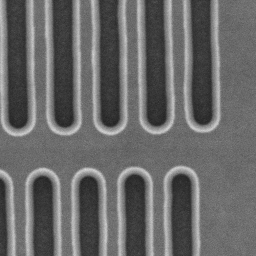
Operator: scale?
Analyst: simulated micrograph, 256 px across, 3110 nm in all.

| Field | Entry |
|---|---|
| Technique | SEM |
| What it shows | groups of lines, slits or small figures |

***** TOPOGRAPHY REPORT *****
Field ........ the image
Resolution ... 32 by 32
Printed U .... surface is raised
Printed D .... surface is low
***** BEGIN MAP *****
DDDDUUDDDUUUDDDUUUDDDUUDDDDUUUUU
DDDDUUDDDUUUDDDUUUDDDUUDDDDUUUUU
DDDDUUDDDDUUDDDUUUDDDUUDDDDUUUUU
DDDDUUDDDDUUDDDUUUDDDUUDDDDUUUUU
DDDDUUDDDDUUDDDUUUDDDUUUDDDUUUUU
DDDDUUDDDUUUDDDUUUDDDUUUDDDUUUUU
DDDDUUDDDDUUDDDUUUDDDUUUDDDUUUUU
DDDDUUDDDDUUDDDUUUDDDUUUDDDUUUUU
DDDDUUDDDDUUDDDUUUDDDUUUDDDUUUUU
DDDDUUDDDDUUDDDUUUDDDUUUDDDUUUUU
DDDDUUDDDDUUDDDUUUDDDUUDDDDUUUUU
DDDDUUDDDDUUDDDUUUDDDUUDDDDUUUUU
UDDDUUDDDDUUDDDUUUDDDUUUDDDUUUUU
UDDDUUDDDDUUDDDUUUDDDUUUDDDUUUUU
UDDDUUDDDDUUDDDUUUDDDUUUDDDUUUUU
UDDDUUUDDUUUDDDUUUDDDUUUDDDUUUUU
UUUUUUUUUUUUUUUUUUUUUUUUUUUUUUUU
UUUUUUUUUUUUUUUUUUUUUUUUUUUUUUUU
UUUUUUUUUUUUUUUUUUUUUUUUUUUUUUUU
UUUUUUUUUUUUUUUUUUUUUUUUUUUUUUUU
UUUUUUUUUUUUUUUUUUUUUUUUUUUUUUUU
UUUUUUUUUUUUUUUUDDUUUUDUUUUUUUUU
DUUUDDDUUUDDDUUDDDUUUDDDUUUUUUUU
DUUUDDDUUDDDDUUDDDDUUDDDUUUUUUUU
DUUUDDDUUDDDDUUDDDDUUDDDUUUUUUUU
DUUUDDDUUDDDDUUDDDDUUDDDUUUUUUUU
DUUUDDDUUDDDDUUDDDDUUDDDUUUUUUUU
DUUUDDDUUDDDDUUDDDDUUDDDUUUUUUUU
DUUUDDDUUDDDDUUDDDDUUDDDUUUUUUUU
DUUUDDDUUDDDDUUDDDDUUDDDUUUUUUUU
DUUUDDDUUDDDDUUDDDDUUDDDDUUUUUUU
DUUUDDDUUUDDDUUDDDDUUDDDDUUUUUUU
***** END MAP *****